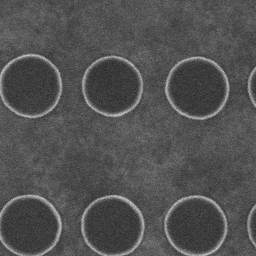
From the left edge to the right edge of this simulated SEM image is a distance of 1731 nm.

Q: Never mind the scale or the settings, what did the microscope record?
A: raised bodies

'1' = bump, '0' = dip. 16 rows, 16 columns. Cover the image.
0000000000000000
0000000000000000
0000000000000000
0100000000000000
1111011110011100
1111011110111100
1110001110011100
0000000000000000
0000000000000000
0000000000000000
0000000000000000
0000000000000000
0110001100011000
1111011110111100
1111011110111100
1110001100011100